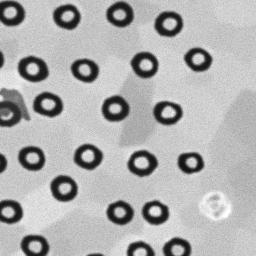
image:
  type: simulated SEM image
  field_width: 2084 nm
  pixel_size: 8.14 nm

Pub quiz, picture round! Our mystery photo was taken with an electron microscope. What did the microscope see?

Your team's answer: a regular array of ring-shaped grooves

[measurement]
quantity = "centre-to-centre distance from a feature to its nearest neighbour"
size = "383 nm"